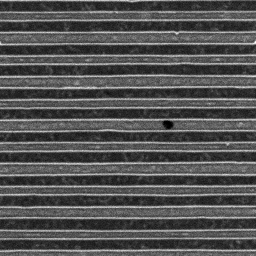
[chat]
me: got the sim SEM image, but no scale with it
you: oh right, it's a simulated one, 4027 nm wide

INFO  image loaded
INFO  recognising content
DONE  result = parallel lines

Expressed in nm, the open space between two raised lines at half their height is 140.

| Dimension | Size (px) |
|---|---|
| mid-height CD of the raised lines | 11.9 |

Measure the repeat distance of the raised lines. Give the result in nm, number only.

343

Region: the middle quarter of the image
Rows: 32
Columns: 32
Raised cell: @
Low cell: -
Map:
@@@@@@@@@@@@@@@@@@@@@@@@@@@@@@@@
@@@@@@@@@@@@@@@@@@@@@@@@@@@@@@@@
@@@@@@@@@@@@@@@@@@@@@@@@@@@@@@@@
--------------------------------
--------------------------------
--------------------------------
@@@@@@@@@@@@@@@@@@@@@@@@@@@@@@@@
@@@@@@@@@@@@@@@@@@@@@@@@@@@@@@@@
@@@@@@@@@@@@@@@@@@@@@@@@@@@@@@@@
--------------------------------
--------------------------------
@@@@@@@@@@@@@@@@@@@@@@@@@@@@@@@@
@@@@@@@@@@@@@@@@@@@@@@@@@@@@@@@@
@@@@@@@@@@@@@@@@@@@@@@@@@@@@@@@@
--------------------------------
--------------------------------
--------------------------------
@@@@@@@@@@@@@@@@@@@@@@@@@@@@@@@@
@@@@@@@@@@@@@@@@@@@@@@@@@@@@@@@@
@@@@@@@@@@@@@@@@@@@@@@@@@@@@@@@@
--------------------------------
--------------------------------
@@@@@@@@@@@@@@@@@@@@@@@@@@@@@@@@
@@@@@@@@@@@@@@@@@@@@@@@@@@@@@@@@
@@@@@@@@@@@@@@@@@@@@@@@@@@@@@@@@
--------------------------------
--------------------------------
--------------------------------
@@@@@@@@@@@@@@@@@@@@@@@@@@@@@@@@
@@@@@@@@@@@@@@@@@@@@@@@@@@@@@@@@
@@@@@@@@------------------------
--------------------------------